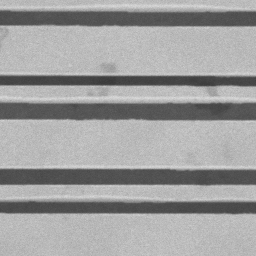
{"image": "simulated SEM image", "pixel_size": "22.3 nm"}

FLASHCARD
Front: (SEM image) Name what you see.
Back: lines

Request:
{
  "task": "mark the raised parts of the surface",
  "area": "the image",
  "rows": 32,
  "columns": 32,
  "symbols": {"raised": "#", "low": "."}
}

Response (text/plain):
################################
................................
................................
################################
################################
################################
################################
################################
################################
................................
................................
################################
..###########..#################
................................
................................
################################
################################
################################
################################
################################
################################
................................
................................
################################
################################
................................
................................
################################
################################
################################
################################
################################